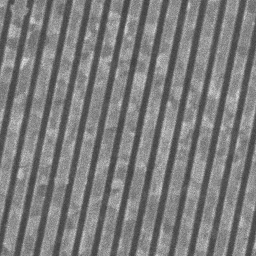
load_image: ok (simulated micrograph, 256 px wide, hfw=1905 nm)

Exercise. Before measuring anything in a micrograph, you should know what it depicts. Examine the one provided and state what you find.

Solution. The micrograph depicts parallel lines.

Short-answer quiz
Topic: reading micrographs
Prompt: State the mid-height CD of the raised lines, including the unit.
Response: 73.8 nm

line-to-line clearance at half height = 0.0656 microns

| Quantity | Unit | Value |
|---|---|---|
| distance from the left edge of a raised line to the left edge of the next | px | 18.9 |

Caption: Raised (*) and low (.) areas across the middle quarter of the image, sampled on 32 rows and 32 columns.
**..**...**...**..***..***..***.
*...**...**..***..***..***..**..
*...**..***..***..***..**...**..
*..***..***..***..**..***...**..
*..***..***..**..***..***..***..
*..***..**..***..***..***..***..
...**..***..***..***..***..**...
..***..***..***..***..**...**...
..***..***..***..**...**..***..*
..***..***..**..***..***..***..*
..**...**..***..***..***..***..*
..**..***..***..***..***..**...*
.***..***..***..***..**...**..**
.***..***..***..**...**..***..**
.***..***..**..***..***..***..**
.***..**..***..***..***..**...**
.**..***..***..***..**...**...**
***..***..***..**...**...**..***
***..***..**...**..***..***..***
***..**...**..***..***..***..**.
**...**..***..***..***..**...**.
**..***..***..***..**...**...**.
**..***..***..**...**...**..***.
**..***..**...**...**..***..***.
*...**...**..***..***..***..**..
*...**..***..***..***..**...**..
*..***..***..***..**...**...**..
*..***..***..**...**...**..***..
*..***..**...**...**..***..***..
*..***..**..***..***..***..**...
...**..***..***..***..**...**...
..***..***..***..**...**...**..*